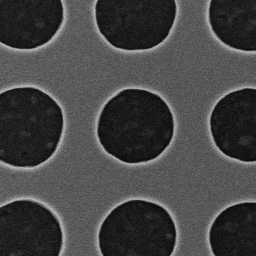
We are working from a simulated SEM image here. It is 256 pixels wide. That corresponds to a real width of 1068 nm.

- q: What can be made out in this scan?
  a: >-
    holes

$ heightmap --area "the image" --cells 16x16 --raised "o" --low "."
....oo.....oo...
....oo.....oo...
...oooo...oooo..
oooooooooooooooo
oooooooooooooooo
o.oooooooooooooo
....ooo...oooo..
....oo.....oo...
....oo.....oo...
...oooo...oooo..
oooooooooooooooo
oooooooooooooooo
oooooooooooooooo
...oooo....ooo..
....oo.....oo...
....oo.....oo...